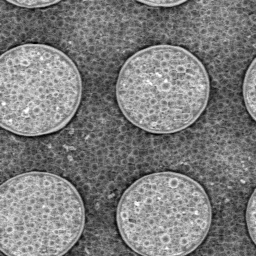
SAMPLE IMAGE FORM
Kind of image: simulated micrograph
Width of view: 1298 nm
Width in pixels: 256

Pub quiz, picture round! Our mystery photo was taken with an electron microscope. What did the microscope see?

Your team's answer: raised bodies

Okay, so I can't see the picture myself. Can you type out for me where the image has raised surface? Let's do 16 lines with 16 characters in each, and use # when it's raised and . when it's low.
................
................
................
####....####....
#####...#####..#
#####..######..#
#####..######..#
####....####....
................
................
................
####....####....
#####...#####...
#####..######..#
#####...#####...
####....####....